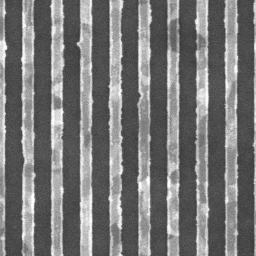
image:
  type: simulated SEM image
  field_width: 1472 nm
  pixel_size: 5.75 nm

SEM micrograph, parallel lines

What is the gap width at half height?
17.9 px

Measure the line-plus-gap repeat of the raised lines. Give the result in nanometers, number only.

167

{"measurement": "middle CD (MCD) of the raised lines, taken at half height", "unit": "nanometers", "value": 62.6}